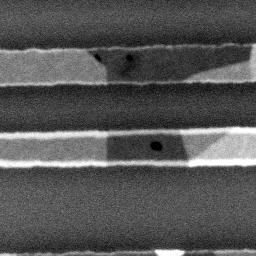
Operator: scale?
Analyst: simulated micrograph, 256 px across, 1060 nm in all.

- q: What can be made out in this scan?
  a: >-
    lines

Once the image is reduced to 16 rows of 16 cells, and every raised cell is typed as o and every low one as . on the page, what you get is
................
................
................
oooooooooooooooo
oooooooooooooooo
................
................
................
oooooooooooooooo
oooooooooooooooo
................
................
................
................
................
................